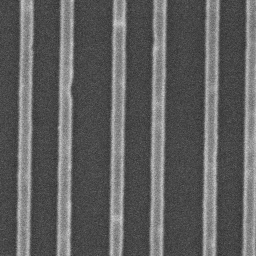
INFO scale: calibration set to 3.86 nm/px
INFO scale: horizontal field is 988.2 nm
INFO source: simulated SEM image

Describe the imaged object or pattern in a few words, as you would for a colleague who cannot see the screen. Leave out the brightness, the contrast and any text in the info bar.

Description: parallel lines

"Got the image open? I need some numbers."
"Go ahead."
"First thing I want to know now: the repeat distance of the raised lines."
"0.178 µm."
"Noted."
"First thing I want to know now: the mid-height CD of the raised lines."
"42.4 nm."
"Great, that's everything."